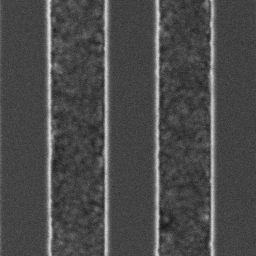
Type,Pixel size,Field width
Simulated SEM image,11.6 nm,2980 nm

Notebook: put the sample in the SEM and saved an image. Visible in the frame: lines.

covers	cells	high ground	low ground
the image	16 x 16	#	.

###....###...###
###....###...###
###....###...###
###....###...###
###....###...###
###....###...###
###....###...###
###....###...###
###....###...###
###....###...###
###....###...###
###....###...###
###....###...###
###....###...###
###....###...###
###....###...###